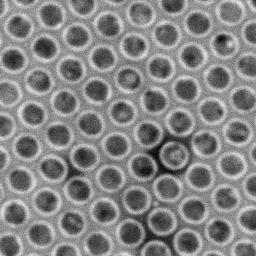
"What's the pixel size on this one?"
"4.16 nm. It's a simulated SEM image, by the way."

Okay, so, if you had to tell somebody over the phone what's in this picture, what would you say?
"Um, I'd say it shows a regular array of raised bodies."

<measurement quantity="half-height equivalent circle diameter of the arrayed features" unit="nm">107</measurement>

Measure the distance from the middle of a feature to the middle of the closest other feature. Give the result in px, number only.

33.3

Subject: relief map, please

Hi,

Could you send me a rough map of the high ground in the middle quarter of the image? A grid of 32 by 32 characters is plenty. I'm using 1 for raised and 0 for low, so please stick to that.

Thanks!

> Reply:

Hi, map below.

11111001111100000000011111100011
11111000011000111100011111100000
11111000000001111110011111100000
11110000000001111110001111000110
00100011110001111110000000001111
00000111111000111110000000011111
00000111111000011100011100011111
11000111111000000000111110001111
11100011111000000000111111001111
11100001110001110001111111000010
11100000000011111000111111000000
11100000000111111100111110001100
11000111000111111100000000111110
00001111100011111100000000111111
00011111110001111000110000111111
10001111110000000001111000111111
11001111110000000011111100011111
11000111100011000011111100001100
11000000001111100011111100000000
11000000001111110001111100000000
10001110001111110000110001111000
00111111001111110000000001111100
00111111000111110000000011111110
00111111100001000111110011111110
00111111000000000111111001111100
00011111000000001111111000111000
10000000011111000111111000000001
00000000111111100111111000000001
00000000111111100011110011100001
01111100011111100000000111111001
01111110011111000000000111111000
11111110001110001111000111111000